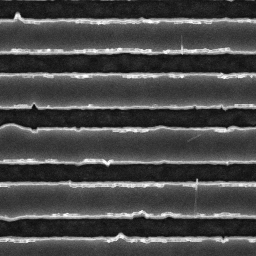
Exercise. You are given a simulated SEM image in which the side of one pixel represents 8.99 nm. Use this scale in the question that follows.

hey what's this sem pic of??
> parallel lines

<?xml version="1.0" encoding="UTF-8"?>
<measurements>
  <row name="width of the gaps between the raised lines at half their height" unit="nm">181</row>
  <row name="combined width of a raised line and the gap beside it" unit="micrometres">0.49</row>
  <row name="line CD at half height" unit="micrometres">0.307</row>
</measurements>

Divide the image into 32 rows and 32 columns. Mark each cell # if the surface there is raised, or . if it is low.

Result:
................................
................................
.###...#.##......#.....#...##.#.
################################
################################
################################
###############.################
................................
................................
################################
################################
################################
################################
.#....###...#.###....##.....#...
................................
................................
################################
################################
################################
################################
.........#...#..................
................................
................................
################################
################################
################################
################################
.#..............................
................................
...............#................
################################
################################